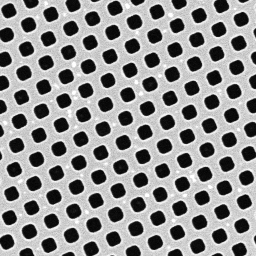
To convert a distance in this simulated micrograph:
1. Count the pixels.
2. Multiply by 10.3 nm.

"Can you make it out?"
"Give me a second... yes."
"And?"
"a regular array of holes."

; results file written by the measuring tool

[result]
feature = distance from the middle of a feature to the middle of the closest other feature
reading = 248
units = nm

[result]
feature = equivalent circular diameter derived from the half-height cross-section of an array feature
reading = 158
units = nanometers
